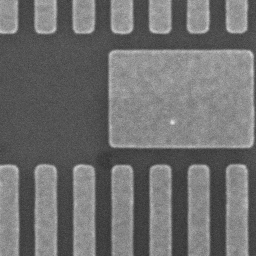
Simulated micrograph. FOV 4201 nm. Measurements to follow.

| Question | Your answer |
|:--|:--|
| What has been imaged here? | wiring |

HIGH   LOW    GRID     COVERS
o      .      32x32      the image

oo..ooo..ooo..ooo..oo...oo..ooo.
oo..ooo..ooo..ooo..oo...oo..ooo.
oo..ooo..ooo..ooo..oo...oo..ooo.
oo..ooo..ooo..ooo..oo...oo..ooo.
................................
................................
..............ooooooooooooooooo.
..............oooooooooooooooooo
..............oooooooooooooooooo
..............oooooooooooooooooo
..............oooooooooooooooooo
..............oooooooooooooooooo
..............oooooooooooooooooo
..............oooooooooooooooooo
..............oooooooooooooooooo
..............oooooooooooooooooo
..............oooooooooooooooooo
..............oooooooooooooooooo
................................
................................
................................
oo..ooo..ooo..ooo..oo...oo..ooo.
oo..ooo..ooo..ooo..oo...oo..ooo.
oo...oo..ooo..ooo..oo...oo..ooo.
oo...oo..ooo..ooo..oo...oo..ooo.
oo...oo..ooo..ooo..oo...oo..ooo.
oo..ooo..ooo..ooo..oo...oo..ooo.
oo..ooo..ooo..ooo..oo...oo..ooo.
oo..ooo..ooo..ooo..oo...oo..ooo.
oo...oo..ooo..ooo..oo...oo..ooo.
oo...oo..ooo..ooo..oo...oo..ooo.
oo...oo..ooo..ooo..oo...oo..ooo.